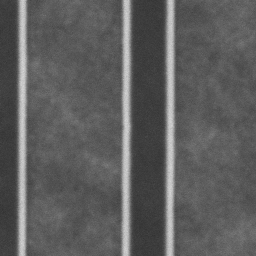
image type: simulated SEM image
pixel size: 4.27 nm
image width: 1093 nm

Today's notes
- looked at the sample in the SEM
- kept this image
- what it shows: one or a few lines or trenches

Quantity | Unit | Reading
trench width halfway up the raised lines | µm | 0.439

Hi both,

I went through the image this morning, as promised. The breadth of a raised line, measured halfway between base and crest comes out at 190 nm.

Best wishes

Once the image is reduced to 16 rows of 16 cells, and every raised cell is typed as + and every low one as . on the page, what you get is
+.......+++.....
+.......+++.....
+.......+++.....
+.......+++.....
+.......+++.....
+.......+++.....
+.......+++.....
+.......+++.....
+.......+++.....
+.......+++.....
+.......+++.....
+.......+++.....
+.......+++.....
+.......+++.....
+.......+++.....
+.......+++.....